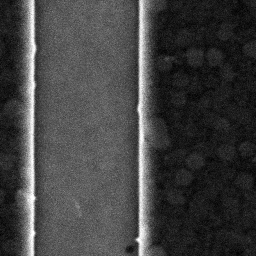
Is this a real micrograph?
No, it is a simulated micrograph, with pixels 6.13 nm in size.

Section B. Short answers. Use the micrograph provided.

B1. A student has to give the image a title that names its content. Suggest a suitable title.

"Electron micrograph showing one or a few lines or trenches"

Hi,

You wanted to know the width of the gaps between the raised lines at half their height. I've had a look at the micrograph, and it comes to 656 nanometres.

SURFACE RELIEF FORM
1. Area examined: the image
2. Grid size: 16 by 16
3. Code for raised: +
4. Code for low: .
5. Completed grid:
++.......+++++++
++.......+++++++
++.......+++++++
++.......+++++++
++.......+++++++
++.......+++++++
++.......+++++++
++.......+++++++
++.......+++++++
++.......+++++++
++.......+++++++
++.......+++++++
++.......+++++++
++.......+++++++
++.......+++++++
++.......+++++++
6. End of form